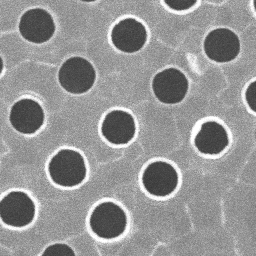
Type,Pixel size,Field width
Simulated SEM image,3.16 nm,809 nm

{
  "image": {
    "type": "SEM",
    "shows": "a regular array of holes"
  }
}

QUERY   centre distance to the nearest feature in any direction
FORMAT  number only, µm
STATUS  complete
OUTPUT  0.207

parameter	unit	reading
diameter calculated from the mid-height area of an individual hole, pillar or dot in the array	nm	114